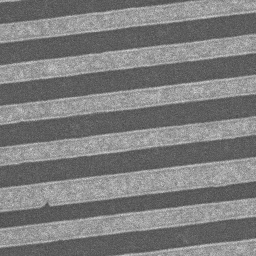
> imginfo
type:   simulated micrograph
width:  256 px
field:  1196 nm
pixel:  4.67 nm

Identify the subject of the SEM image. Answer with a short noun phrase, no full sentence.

parallel lines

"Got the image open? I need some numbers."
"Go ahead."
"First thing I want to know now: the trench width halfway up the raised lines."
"110 nanometers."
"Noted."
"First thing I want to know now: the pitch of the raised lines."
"190 nm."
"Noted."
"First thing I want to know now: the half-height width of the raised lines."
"81.2 nm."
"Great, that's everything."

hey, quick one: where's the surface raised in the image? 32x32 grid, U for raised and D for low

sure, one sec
DDDDDDDDDDDDDDDDDDDDDDUUUUUUUUUU
DDDDDDDDDDDDDDUUUUUUUUUUUUUUUUUU
DDDDDDUUUUUUUUUUUUUUUUUDDDDDDDDD
UUUUUUUUUUUUUUUDDDDDDDDDDDDDDDDD
UUUUUUUDDDDDDDDDDDDDDDDDDDDDDDDU
DDDDDDDDDDDDDDDDDDDDDDDUUUUUUUUU
DDDDDDDDDDDDDDUUUUUUUUUUUUUUUUUU
DDDDDDDUUUUUUUUUUUUUUUUUDDDDDDDD
UUUUUUUUUUUUUUUDDDDDDDDDDDDDDDDD
UUUUUUUDDDDDDDDDDDDDDDDDDDDDDDDU
DDDDDDDDDDDDDDDDDDDDDDDDUUUUUUUU
DDDDDDDDDDDDDDDUUUUUUUUUUUUUUUUU
DDDDDDDUUUUUUUUUUUUUUUUUUDDDDDDD
UUUUUUUUUUUUUUUUUDDDDDDDDDDDDDDD
UUUUUUUUDDDDDDDDDDDDDDDDDDDDDDDD
DDDDDDDDDDDDDDDDDDDDDDDDDUUUUUUU
DDDDDDDDDDDDDDDDDUUUUUUUUUUUUUUU
DDDDDDDDDUUUUUUUUUUUUUUUUUDDDDDD
UUUUUUUUUUUUUUUUUUDDDDDDDDDDDDDD
UUUUUUUUUDDDDDDDDDDDDDDDDDDDDDDD
UDDDDDDDDDDDDDDDDDDDDDDDDDUUUUUU
DDDDDDDDDDDDDDDDDUUUUUUUUUUUUUUU
DDDDDDDDDUUUUUUUUUUUUUUUUUUUUUUU
DUUUUUUUUUUUUUUUUUUUUUUUDDDDDDDD
UUUUUUUUUUUUUUUDDDDDDDDDDDDDDDDD
UUUUUDUUDDDDDDDDDDDDDDDDDDDUUUUU
DDDDDDDDDDDDDDDDDDUUUUUUUUUUUUUU
DDDDDDDDDDUUUUUUUUUUUUUUUUUDDDDD
DDUUUUUUUUUUUUUUUUUDDDDDDDDDDDDD
UUUUUUUUUUUDDDDDDDDDDDDDDDDDDDDD
UUUDDDDDDDDDDDDDDDDDDDDDDDDDUUUU
DDDDDDDDDDDDDDDDDDDDUUUUUUUUUUUU